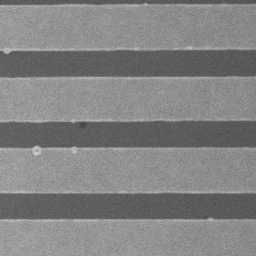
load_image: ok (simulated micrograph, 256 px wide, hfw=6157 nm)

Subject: lines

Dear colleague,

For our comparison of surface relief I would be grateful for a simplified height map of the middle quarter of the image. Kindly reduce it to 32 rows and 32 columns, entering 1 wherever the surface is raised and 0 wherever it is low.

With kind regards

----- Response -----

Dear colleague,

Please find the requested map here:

00000000000000000000000000000000
00000000000000000000000000000000
00000000000000000000000000000000
11111111111111111111111111111111
11111111111111111111111111111111
11111111111111111111111111111111
11111111111111111111111111111111
11111111111111111111111111111111
11111111111111111111111111111111
11111111111111111111111111111111
11111111111111111111111111111111
11111111111111111111111111111111
11111111111111111111111111111111
11111111111111111111111111111111
00000000000000000000000000000000
00000000000000000000000000000000
00000000000000000000000000000000
00000000000000000000000000000000
00000000000000000000000000000000
00000000000000000000000000000000
00000000000000000000000000000000
11111111111111111111111111111111
11111111111111111111111111111111
11111111111111111111111111111111
11111111111111111111111111111111
11111111111111111111111111111111
11111111111111111111111111111111
11111111111111111111111111111111
11111111111111111111111111111111
11111111111111111111111111111111
11111111111111111111111111111111
11111111111111111111111111111111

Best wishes